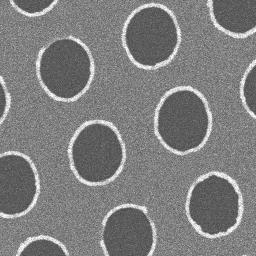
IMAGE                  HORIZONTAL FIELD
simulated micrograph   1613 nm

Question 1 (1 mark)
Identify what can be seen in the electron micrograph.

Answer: holes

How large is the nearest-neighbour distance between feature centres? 570 nanometers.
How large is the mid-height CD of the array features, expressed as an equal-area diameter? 0.343 um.